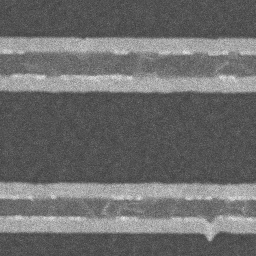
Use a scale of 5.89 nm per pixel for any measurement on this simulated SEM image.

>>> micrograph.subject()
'one or a few lines or trenches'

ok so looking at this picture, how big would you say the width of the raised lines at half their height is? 40.1 pixels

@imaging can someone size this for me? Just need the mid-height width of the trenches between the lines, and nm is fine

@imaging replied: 612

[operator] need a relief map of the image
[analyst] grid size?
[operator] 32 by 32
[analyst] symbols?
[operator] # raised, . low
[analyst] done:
................................
................................
................................
................................
................................
########........................
################################
################################
################################
################################
################################
................................
................................
................................
................................
................................
................................
................................
................................
................................
................................
................................
................................
................................
################################
################################
################################
################################
.........................##.....
................................
................................
................................